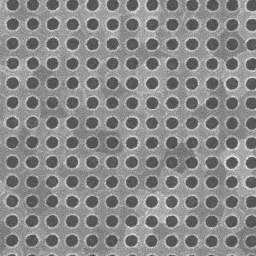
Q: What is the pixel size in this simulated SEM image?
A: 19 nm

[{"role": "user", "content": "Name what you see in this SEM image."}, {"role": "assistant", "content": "a regular array of holes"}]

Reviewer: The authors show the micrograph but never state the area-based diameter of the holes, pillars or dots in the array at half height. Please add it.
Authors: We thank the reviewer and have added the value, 243 nm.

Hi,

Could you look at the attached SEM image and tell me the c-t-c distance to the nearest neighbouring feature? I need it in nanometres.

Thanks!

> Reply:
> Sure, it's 371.